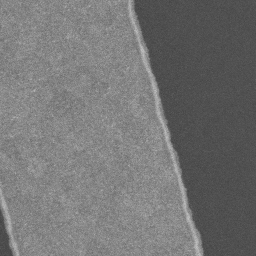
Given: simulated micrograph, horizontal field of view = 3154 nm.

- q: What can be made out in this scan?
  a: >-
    one or a few lines or trenches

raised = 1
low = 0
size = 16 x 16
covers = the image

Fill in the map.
1111111100000000
1111111100000000
1111111110000000
1111111110000000
1111111110000000
1111111111000000
1111111111000000
1111111111000000
1111111111000000
1111111111100000
1111111111100000
1111111111100000
1111111111110000
1111111111110000
0111111111110000
0111111111110000